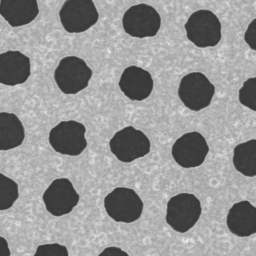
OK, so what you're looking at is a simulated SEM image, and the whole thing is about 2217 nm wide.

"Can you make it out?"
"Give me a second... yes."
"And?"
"a regular array of holes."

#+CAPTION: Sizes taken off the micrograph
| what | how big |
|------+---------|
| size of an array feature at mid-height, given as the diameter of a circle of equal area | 317 nm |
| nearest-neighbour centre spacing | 520 nm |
